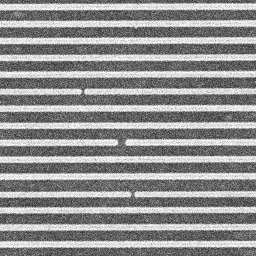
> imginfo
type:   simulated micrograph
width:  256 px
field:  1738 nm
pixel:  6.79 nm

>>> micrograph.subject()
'parallel lines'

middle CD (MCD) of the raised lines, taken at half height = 30.6 nanometres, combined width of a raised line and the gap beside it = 115 nm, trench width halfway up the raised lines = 79.8 nm